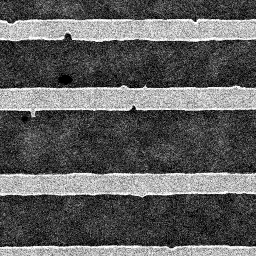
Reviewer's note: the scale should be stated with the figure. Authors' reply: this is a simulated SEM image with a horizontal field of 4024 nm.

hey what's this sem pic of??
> one or a few lines or trenches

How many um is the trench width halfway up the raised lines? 0.829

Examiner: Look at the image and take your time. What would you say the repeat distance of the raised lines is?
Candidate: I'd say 1210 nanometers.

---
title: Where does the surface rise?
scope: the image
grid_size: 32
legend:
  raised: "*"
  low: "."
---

................................
................................
.......*.................*......
********************************
********.***********************
................................
................................
................................
................................
................................
................................
********************************
********************************
****************.***************
................................
................................
................................
................................
................................
................................
................................
................................
********************************
********************************
................................
................................
................................
................................
................................
................................
................................
********************************